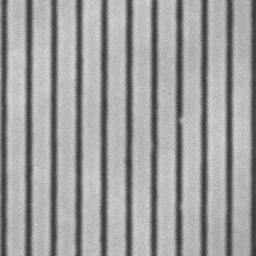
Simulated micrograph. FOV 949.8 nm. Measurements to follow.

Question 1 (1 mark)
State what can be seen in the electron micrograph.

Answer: parallel lines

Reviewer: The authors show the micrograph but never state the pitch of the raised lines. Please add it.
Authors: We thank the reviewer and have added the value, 93 nanometers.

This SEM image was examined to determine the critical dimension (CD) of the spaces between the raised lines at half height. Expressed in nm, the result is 26.4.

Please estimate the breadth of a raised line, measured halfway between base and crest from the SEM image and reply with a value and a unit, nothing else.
0.0663 micrometres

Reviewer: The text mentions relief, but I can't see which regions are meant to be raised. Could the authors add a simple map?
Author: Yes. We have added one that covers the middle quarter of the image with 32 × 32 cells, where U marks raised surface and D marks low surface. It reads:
UUUDDUUUUDDUUUUDDUUUUUDDUUUUDDUU
UUUDDUUUUDDUUUUDDUUUUUDDUUUUDDUU
UUUDDUUUUDDUUUUDDUUUUUDDUUUUDDUU
UUUDDUUUUDDUUUUDDUUUUUDDUUUUDDUU
UUUDDUUUUDDUUUUDDUUUUUDDUUUUDDUU
UUUDDUUUUDDUUUUDDUUUUUDDUUUUDDUU
UUUDDUUUUDDUUUUDDUUUUUDDUUUUDDUU
UUUDDUUUUDDUUUUDDUUUUUDDUUUUDDUU
UUUDDUUUUDDUUUUDDUUUUUDDUUUUDDUU
UUUDDUUUUDDUUUUDDUUUUUDDUUUUDDUU
UUUDDUUUUDDUUUUDDUUUUUDDUUUUDDUU
UUUDDUUUUDDUUUUDDUUUUUDDUUUUDDUU
UUUDDUUUUDDUUUUDDUUUUDDDUUUUDDUU
UUUDDUUUUDDUUUUDDDUUUDDDUUUUDUUU
UUUDDUUUUDDUUUUDDUUUUDDDUUUUDUUU
UUUDDUUUUDDUUUUDDUUUUDDDUUUUDDUU
UUUDDUUUUDDUUUUDDUUUUDDDUUUUDDUU
UUUDDUUUUDDUUUUDDUUUUDDDUUUUDDUU
UUUDDUUUUDDUUUUDDUUUUDDDUUUUDDUU
UUUDDUUUUDDUUUUDDUUUUUDDUUUUDDUU
UUUDDUUUUDDUUUUDDUUUUUDDUUUUDDUU
UUUDDUUUUDDUUUUDDUUUUUDDUUUUDDUU
UUUDDUUUUDDUUUUDDUUUUDDDUUUUDDUU
UUUDDUUUUDDUUUUDDUUUUDDDUUUUDDUU
UUUDDUUUUDDUUUUDDUUUUDDUUUUUDDUU
UUUDDUUUUDDUUUUDDUUUUDDUUUUUDDUU
UUUDDUUUUDDUUUUDDUUUUDDUUUUUDDUU
UUUDDUUUUDDUUUUDDUUUUDDUUUUUDDUU
UUUDDUUUUDDUUUUDDUUUUDDUUUUUDDUU
UUUDDUUUUDDUUUUDDUUUUDDUUUUUDDUU
UUUDDUUUUDDUUUUDDUUUUDDUUUUUDDUU
UUUDDUUUUDDUUUUDDUUUUDDUUUUUDDUU